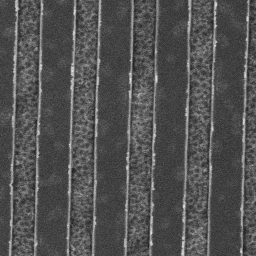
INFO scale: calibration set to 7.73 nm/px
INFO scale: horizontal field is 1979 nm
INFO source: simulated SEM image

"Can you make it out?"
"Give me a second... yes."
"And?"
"parallel lines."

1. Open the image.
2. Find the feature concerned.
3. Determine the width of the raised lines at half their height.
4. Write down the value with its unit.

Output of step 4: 0.258 micrometres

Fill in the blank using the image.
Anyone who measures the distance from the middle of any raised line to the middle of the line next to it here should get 446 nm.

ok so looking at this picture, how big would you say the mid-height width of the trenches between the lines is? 184 nm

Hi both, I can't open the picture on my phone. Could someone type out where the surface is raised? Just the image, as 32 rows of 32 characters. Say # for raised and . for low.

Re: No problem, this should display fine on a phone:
##...####....####...####...####.
##...####...#####...####...####.
##...####...#####...####...####.
##...####...#####...####...####.
##...####...#####...####...####.
##...####...####....####...####.
##...####...####...#####...####.
##...####...####...#####...####.
##...####...####...#####...####.
##...####...####...#####...####.
##...####...####...#####...####.
##...####...####...#####...####.
##...####...####...####....####.
##...####...####...####....####.
##...####...####...####...#####.
##...####...####...####...#####.
##...####...####...####...####..
##...####...####...####...####..
##...####...####...####...####..
##...####...####...####...####..
##...####...####...####...####..
#....####...####...####...####..
#....####...####...####...####..
#....####...####...####...####..
##...####...####...####...####..
#....####...####...####...####..
#....####...####...####...####..
#...#####...####...####...####..
#...#####...####...####...####..
#...####....####...####...####..
#...####....####...####...####..
#...#####...####...####...####..